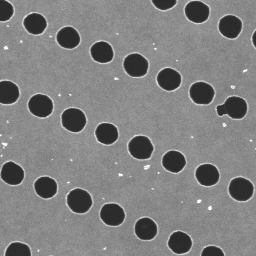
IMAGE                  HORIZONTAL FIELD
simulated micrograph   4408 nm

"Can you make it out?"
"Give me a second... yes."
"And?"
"a regular array of holes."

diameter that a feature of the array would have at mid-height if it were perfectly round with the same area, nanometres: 388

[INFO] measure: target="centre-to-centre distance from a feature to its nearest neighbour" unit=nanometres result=618